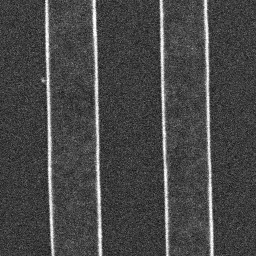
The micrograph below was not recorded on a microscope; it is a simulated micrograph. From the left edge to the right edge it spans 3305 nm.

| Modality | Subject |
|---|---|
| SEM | one or a few lines or trenches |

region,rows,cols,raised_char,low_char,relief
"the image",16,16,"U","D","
DDDUUUDDDDUUUDDD
DDDUUUDDDDUUUDDD
DDDUUUDDDDUUUDDD
DDDUUUDDDDUUUDDD
DDDUUUDDDDUUUDDD
DDDUUUDDDDUUUDDD
DDDUUUDDDDUUUDDD
DDDUUUDDDDUUUDDD
DDDUUUDDDDUUUDDD
DDDUUUDDDDUUUDDD
DDDUUUDDDDUUUDDD
DDDUUUDDDDUUUDDD
DDDUUUDDDDUUUDDD
DDDUUUDDDDUUUDDD
DDDUUUDDDDUUUDDD
DDDUUUDDDDUUUDDD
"